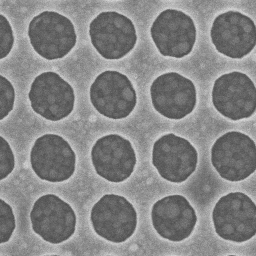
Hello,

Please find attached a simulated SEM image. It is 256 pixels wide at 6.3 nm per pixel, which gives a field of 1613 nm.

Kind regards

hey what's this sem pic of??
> a regular array of holes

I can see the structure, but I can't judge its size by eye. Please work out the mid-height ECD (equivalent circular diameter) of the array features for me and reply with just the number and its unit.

295 nanometres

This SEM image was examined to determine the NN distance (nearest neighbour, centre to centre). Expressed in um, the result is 0.38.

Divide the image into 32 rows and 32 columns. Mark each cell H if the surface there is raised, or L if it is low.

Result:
HHHHHHHHHHHHHHHHHHHHHHHHHHHHHHHH
HHHHHLLHHHHHHLHHHHHHLLLHHHHHLLHH
LHHHLLLLLHHHLLLLHHHLLLLLHHHLLLLH
LHHHLLLLLHHLLLLLLHHLLLLLHHLLLLLL
LLHHLLLLLLHLLLLLLHHLLLLLLHLLLLLL
LLHHLLLLLHHHLLLLLHHLLLLLHHHLLLLL
LHHHHLLLLHHHLLLLHHHHLLLLHHHLLLLH
HHHHHHHHHHHHHHHHHHHHHHHHHHHHHHHH
HHHHHHHHHHHHHHHHHHHHHHHHHHHHHHHH
HHHHHLLHHHHHLLLLHHHHLLLHHHHHLLLH
LHHHLLLLLHHHLLLLLHHLLLLLHHHLLLLL
LLHHLLLLLHHLLLLLLHHLLLLLLHHLLLLL
LLHHLLLLLHHLLLLLLHHLLLLLLHHLLLLL
LLHHLLLLLHHHLLLLLHHLLLLLHHHLLLLL
LHHHHLLLHHHHHLLLHHHHHLLHHHHHLLLH
HHHHHHHHHHHHHHHHHHHHHHHHHHHHHHHH
HHHHHHHHHHHHHHHHHHHHHHHHHHHHHLHH
LHHHHLLLHHHHLLLLHHHHLLLHHHHLLLLH
LHHHLLLLLHHHLLLLLHHLLLLLHHLLLLLL
LLHHLLLLLHHLLLLLLHHLLLLLLHLLLLLL
LLHHLLLLLHHHLLLLLHHLLLLLLHHLLLLL
LHHHLLLLLHHHLLLLLHHHLLLLHHHLLLLL
HHHHHHLLHHHHHLLLHHHHHLLHHHHHHLHH
HHHHHHHHHHHHHHHHHHHHHHHHHHHHHHHH
HHHHHLLHHHHHHLLHHHHHHLLHHHHHLLLH
LHHHLLLLHHHHLLLLHHHLLLLLHHHLLLLL
LLHHLLLLLHHLLLLLLHHLLLLLHHHLLLLL
LLHHLLLLLLHLLLLLLHHLLLLLLHHLLLLL
LLHHLLLLLHHHLLLLLHHLLLLLHHHLLLLL
LHHHHLLLLHHHLLLLHHHHLLLLHHHLLLLL
HHHHHHHHHHHHHHHHHHHHHHHHHHHHHHHH
HHHHHHHHHHHHHHHHHHHHHHHHHHHHHHHH